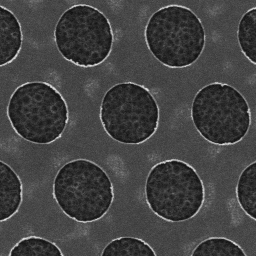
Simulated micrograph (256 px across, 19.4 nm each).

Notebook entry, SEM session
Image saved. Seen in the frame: holes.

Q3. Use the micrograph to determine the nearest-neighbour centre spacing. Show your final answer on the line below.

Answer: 1740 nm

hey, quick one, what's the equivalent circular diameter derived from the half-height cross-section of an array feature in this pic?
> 1140 nm